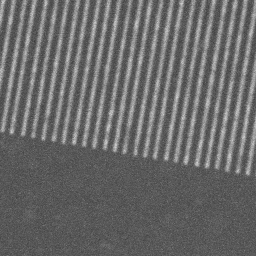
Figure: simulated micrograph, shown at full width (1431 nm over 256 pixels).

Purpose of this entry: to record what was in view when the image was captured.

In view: parallel lines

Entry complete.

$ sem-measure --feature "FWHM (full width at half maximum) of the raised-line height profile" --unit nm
16.6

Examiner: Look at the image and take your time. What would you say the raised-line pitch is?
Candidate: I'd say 0.0581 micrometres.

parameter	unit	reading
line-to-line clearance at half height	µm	0.042